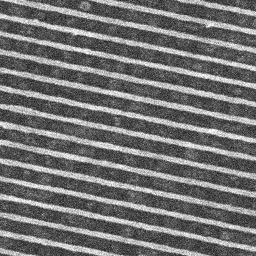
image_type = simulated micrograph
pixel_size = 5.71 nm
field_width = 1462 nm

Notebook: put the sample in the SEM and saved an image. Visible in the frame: parallel lines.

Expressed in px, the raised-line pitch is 17.7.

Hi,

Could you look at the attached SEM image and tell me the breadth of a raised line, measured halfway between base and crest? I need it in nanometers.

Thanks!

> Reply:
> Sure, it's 25.9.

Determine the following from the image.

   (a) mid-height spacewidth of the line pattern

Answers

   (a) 76.8 nanometres